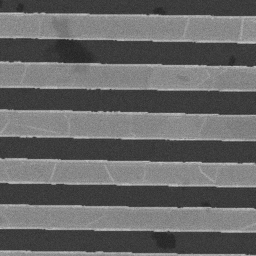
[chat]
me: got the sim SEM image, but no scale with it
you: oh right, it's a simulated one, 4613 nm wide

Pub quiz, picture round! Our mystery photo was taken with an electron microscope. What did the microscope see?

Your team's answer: lines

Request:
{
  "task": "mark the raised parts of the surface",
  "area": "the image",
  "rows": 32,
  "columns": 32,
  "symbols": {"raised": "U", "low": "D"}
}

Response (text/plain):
DDDDDDDDDDDDDDDDDDDDDDDDDDDDDDDD
DDDDDDDDDDDDDDDDDDDDDDDDDDDDDDDD
UUUUUUUUUUUUUUUUUUUUUUUUUUUUUUUU
UUUUUUUUUUUUUUUUUUUUUUUUUUUUUUUU
UUUUUUUUUUUUUUUUUUUUUUUUUUUUUUUU
DDDDDDDDDDDDDDDDDDDDDDDDDDDDDDDD
DDDDDDDDDDDDDDDDDDDDDDDDDDDDDDDD
DDDDDDDDDDDDDDDDDDDDDDDDDDDDDDDD
UUUUUUUUUUUUUUUUUUUUUUUUUUUUUUUU
UUUUUUUUUUUUUUUUUUUUUUUUUUUUUUUU
UUUUUUUUUUUUUUUUUUUUUUUUUUUUUUUU
DDDDDDDDDDDDDDDDDDDDDDDDDDDDDDDD
DDDDDDDDDDDDDDDDDDDDDDDDDDDDDDDD
DDDDDDDDDDDDDDDDDDDDDDDDDDDDDDDD
UUUUUUUUUUUUUUUUUUUUUUUUUUUUUUUU
UUUUUUUUUUUUUUUUUUUUUUUUUUUUUUUU
UUUUUUUUUUUUUUUUUUUUUUUUUUUUUUUU
DDDDDDDDDDDDDDDDDDDDDDDDDDDDDDUU
DDDDDDDDDDDDDDDDDDDDDDDDDDDDDDDD
DDDDDDDDDDDDDDDDDDDDDDDDDDDDDDDD
UUUUUUUUUUUUUUUUUUUUUUUUUUUUUDDD
UUUUUUUUUUUUUUUUUUUUUUUUUUUUUUUU
UUUUUUUUUUUUUUUUUUUUUUUUUUUUUUUU
DDDDDDDDDDDDDDDDDDDDDDDDDDDDDDDD
DDDDDDDDDDDDDDDDDDDDDDDDDDDDDDDD
DDDDDDDDDDDDDDDDDDDDDDDDDDDDDDDD
UUUUUUUUUUUUUUUUUUUUUUUUUUUUUUUU
UUUUUUUUUUUUUUUUUUUUUUUUUUUUUUUU
UUUUUUUUUUUUUUUUUUUUUUUUUUUUUUUU
DDDDDDDDDDDDDDDDDDDDDDDDDDDDDDDD
DDDDDDDDDDDDDDDDDDDDDDDDDDDDDDDD
UUUUUUUUUUDDDDDDDDDDDDDDDDDDDDDD